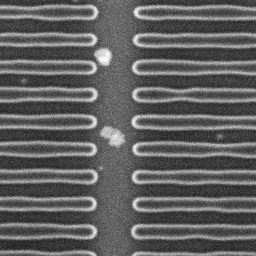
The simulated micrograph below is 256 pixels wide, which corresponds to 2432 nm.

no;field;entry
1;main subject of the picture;groups of lines, slits or small figures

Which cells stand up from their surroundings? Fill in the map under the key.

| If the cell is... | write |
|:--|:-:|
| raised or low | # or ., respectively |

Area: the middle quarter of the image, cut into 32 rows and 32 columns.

########.........###############
########.........###############
.............................###
................................
................................
................................
#######...........#########....#
########.........###############
########..........##############
................................
................................
................................
................................
#######...........##############
########.........###############
#######...........##############
................................
................................
................................
................................
########..........##############
########.........###############
#######...........##############
................................
................................
................................
................................
########..........##############
########.........###############
....###...........###......#####
................................
................................